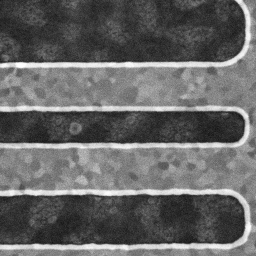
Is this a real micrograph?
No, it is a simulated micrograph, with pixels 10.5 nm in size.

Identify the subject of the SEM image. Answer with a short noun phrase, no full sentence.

one or a few lines or trenches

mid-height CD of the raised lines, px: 46.8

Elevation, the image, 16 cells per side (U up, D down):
DDDDDDDDDDDDDDDU
DDDDDDDDDDDDDDDD
DDDDDDDDDDDDDDDU
DDDDDDDDDDDDDDDU
UUUUUUUUUUUUUUUU
UUUUUUUUUUUUUUUU
UUUUUUUUUUUUUUUU
DDDDDDDDDDDDDDDU
DDDDDDDDDDDDDDDU
UUUUUUUUUUUUUUUU
UUUUUUUUUUUUUUUU
UUUUUUUUUUUUUUUU
DDDDDDDDDDDDDDDU
DDDDDDDDDDDDDDDU
DDDDDDDDDDDDDDDU
UUUUUUUUUUUUUUUU